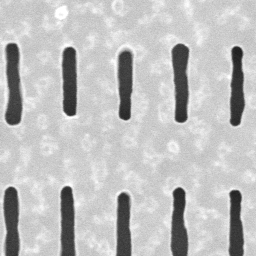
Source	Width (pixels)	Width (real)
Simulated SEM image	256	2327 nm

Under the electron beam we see holes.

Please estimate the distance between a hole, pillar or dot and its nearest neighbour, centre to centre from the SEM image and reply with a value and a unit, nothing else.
506 nanometers